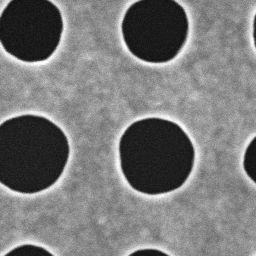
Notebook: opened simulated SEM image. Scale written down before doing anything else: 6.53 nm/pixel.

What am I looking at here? holes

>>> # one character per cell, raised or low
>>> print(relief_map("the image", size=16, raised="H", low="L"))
LLLLHHHHLLLHHHHH
LLLLHHHHLLLLHHHH
LLLLHHHHLLLLHHHH
HLLHHHHHHLLHHHHH
HHHHHHHHHHHHHHHH
HHHHHHHHHHHHHHHH
HHHHHHHHHHHHHHHH
LLLHHHHHHLHHHHHH
LLLLHHHHLLLLHHHH
LLLLHHHLLLLLHHHL
LLLLHHHHLLLLHHHL
LLLHHHHHLLLHHHHH
HHHHHHHHHHHHHHHH
HHHHHHHHHHHHHHHH
HHHHHHHHHHHHHHHH
HLLHHHHHHHHHHHHH